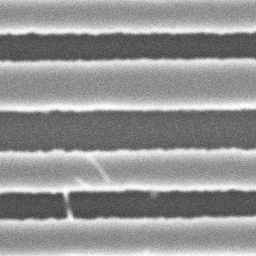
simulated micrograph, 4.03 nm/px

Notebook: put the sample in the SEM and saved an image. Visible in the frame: lines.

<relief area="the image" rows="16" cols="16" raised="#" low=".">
################
################
................
................
################
################
################
................
................
...##.##########
################
################
................
................
################
################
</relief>